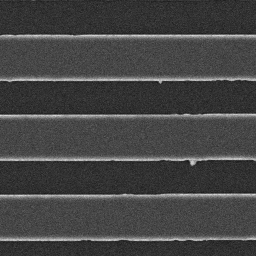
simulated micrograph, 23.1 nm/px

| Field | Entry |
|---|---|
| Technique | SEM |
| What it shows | lines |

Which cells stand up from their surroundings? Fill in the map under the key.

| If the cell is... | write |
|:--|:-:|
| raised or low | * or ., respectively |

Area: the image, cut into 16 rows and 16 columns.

................
................
****************
****************
****************
................
................
****************
****************
****************
................
................
****************
****************
****************
................